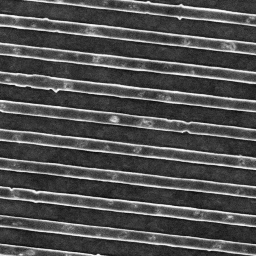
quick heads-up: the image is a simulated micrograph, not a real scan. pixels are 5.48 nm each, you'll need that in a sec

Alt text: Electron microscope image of parallel lines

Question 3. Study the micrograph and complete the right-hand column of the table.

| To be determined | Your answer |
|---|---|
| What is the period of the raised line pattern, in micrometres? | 0.156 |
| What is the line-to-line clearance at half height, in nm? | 92.6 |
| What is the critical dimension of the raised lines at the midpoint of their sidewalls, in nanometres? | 63.4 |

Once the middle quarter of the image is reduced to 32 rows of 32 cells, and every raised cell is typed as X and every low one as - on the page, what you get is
---------XXXXXXXXXXXXXXXXXXXXXXX
------------------XXXXXXXXXXXXXX
-----------------------------XXX
--------------------------------
XXXXXX--------------------------
XXXXXXXXXXXXXX------------------
XXXXXXXXXXXXXXXXXXXXXXX---------
--------XXXXXXXXXXXXXXXXXXXXXXXX
-----------------XXXXXXXXXXXXXXX
-------------------------XXXXXXX
--------------------------------
XXXX----------------------------
XXXXXXXXXXXXXXX-----------------
XXXXXXXXXXXXXXXXXXXXXX----------
--------XXXXXXXXXXXXXXXXXXXXXX--
-----------------XXXXXXXXXXXXXXX
------------------------XXXXXXXX
--------------------------------
XXX-----------------------------
XXXXXXXXXXXX--------------------
XXXXXXXXXXXXXXXXXXXX------------
-----XXXXXXXXXXXXXXXXXXXXXXXX---
----------------XXXXXXXXXXXXXXXX
------------------------XXXXXXXX
-------------------------------X
X-------------------------------
XXXXXXXXXX----------------------
XXXXXXXXXXXXXXXXXXX-------------
----XXXXXXXXXXXXXXXXXXXXXXXX----
------------XXXXXXXXXXXXXXXXXXXX
---------------------XXXXXXXXXXX
------------------------------XX